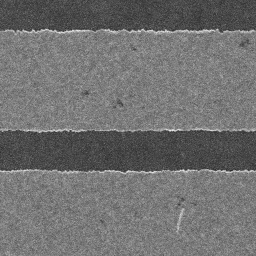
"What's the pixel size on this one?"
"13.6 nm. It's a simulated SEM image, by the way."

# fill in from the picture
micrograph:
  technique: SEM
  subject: one or a few lines or trenches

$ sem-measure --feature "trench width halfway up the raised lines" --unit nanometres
539